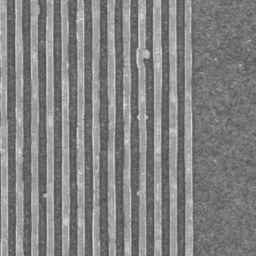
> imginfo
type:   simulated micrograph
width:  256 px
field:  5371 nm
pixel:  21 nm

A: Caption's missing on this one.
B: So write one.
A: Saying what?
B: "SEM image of parallel lines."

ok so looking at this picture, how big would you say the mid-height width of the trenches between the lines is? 184 nm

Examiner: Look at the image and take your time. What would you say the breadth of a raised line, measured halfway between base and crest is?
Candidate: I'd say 123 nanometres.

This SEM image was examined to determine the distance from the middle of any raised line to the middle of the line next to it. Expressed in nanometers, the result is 322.